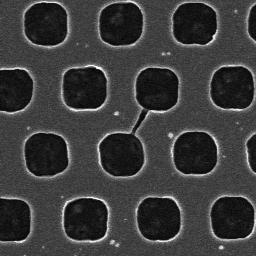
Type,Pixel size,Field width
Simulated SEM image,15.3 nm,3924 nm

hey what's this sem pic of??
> a regular array of holes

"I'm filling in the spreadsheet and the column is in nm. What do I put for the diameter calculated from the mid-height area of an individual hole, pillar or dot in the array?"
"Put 694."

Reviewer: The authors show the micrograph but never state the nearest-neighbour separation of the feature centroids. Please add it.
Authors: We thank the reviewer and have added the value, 1130 nanometres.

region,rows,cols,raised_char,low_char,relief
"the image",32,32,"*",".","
****...*******...******...******
***.....*****.....****.....****.
***.....****......****.....****.
***.....****......****.....****.
***.....*****....*****.....****.
*****..*******...******.*.******
********************************
********************************
**********..****************...*
....****.....****.....*****....*
....****.....****.....****......
....****.....****.....****......
....****.....****.....*****.....
...******...******...*******...*
*****************.**************
*****************.**************
****************.*******.*******
***.....*****....*****.....****.
***.....****......****.....****.
***.....*****.....****.....****.
***.....*****.....****.....****.
****....*****....******...******
********************************
********************************
********************************
...*****.....****.....*****....*
....****.....****.....****......
....****.....****......***......
....****.....****.....*****.....
...*****.....*****....*****....*
********************************
********************************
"